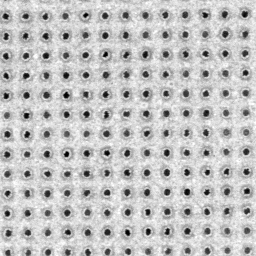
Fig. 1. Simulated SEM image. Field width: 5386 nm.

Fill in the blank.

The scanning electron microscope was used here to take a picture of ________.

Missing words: a regular array of holes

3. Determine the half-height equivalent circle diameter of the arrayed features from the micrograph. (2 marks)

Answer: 146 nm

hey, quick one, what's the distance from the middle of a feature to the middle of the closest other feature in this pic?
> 0.41 µm